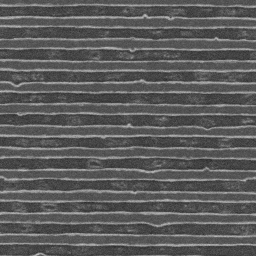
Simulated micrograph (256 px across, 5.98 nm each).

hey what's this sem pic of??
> parallel lines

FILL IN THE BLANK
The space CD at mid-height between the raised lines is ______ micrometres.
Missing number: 0.0695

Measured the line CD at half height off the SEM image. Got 58.3 nm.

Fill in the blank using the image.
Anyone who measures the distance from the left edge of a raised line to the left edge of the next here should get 130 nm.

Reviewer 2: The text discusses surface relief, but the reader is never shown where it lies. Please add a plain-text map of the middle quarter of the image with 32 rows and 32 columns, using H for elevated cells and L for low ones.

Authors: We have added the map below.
HHHHHHHHHHHHHHHHHHHHHHHHHHHHHHHH
HHHHHHHHHHHHHHHHHHHHHHHHHHHHHHHH
LLLLLLLLLLLLLLLLLLLLLLLLLLLLLLLL
LLLLLLLLLLLLLLLLLLLLLLLLLLLLLLLL
LLLLLLLLLLLLLLLLLLHHLLLLLLLLLLLL
HHHHHHHHHHHHHHHHHHHHHHHHHHHHHHHH
HHHHHHHHHHHHHHHHHHHHHHHHHHHHHHHH
LLLLLLLLLLLLLLLLLLLLLLLLLLLLLLLL
LLLLLLLLLLLLLLLLLLLLLLLLLLLLLLLL
LLLLLLLLLLLLLLLLLLLLLLLLLLLLLLLL
HHHHHHHHHHHHHHHHHHHHHHHHHHHHHHHH
HHHHHHHHHHHHHHHHHHHHHHHHHHHHHHHH
LLLLLLLLHHHHHHHHHHLHHHHHHHHHHHHH
LLLLLLLLLLLLLLLLLLLLLLLLLLLLLLLL
LLLLLLLLLLLLLLLLLLLLLLLLLLLLLLLL
LLLLLLLHHHHHHHHHHLLLLLLLLLLLLLLL
HHHHHHHHHHHHHHHHHHHHHHHHHHHHHHHH
HHHHHHHHHHHHHHHHHHHHHHHHHHHHHHHH
LLLLLLLLLLLLLLLLLLLLLLLLLLLLLLLL
LLLLLLLLLLLLLLLLLLLLLLLLLLLLLLLL
LLLLLLLLLLLLLLLLLLLLLLLLLLLLLLLL
HHHHHHHHHHHHHHHHHHHHHHHHHHHHHHHH
HHHHHHHHHHHHHHHHHHHHHHHHHHHHHHHH
LLLLLLLLLHHLLLLLLLLLLLLLLLLHHHHH
LLLLLLLLLLLLLLLLLLLLLLLLLLLLLLLL
LLLLLLLLLLLLLLLLLLLLLLLLLLLLLLLL
HHHLLLLLHHHHHHHHHHHLLLLLLHHHLLLH
HHHHHHHHHHHHHHHHHHHHHHHHHHHHHHHH
HHHHHHHHHHHHHHHHHHHHHHHHHHHHHHHH
LLLLLLLLLLLLLLLLLLLLLLLLLLLLLLLL
LLLLLLLLLLLLLLLLLLLLLLLLLLLLLLLL
LLLLLLLLLLLLLLLLLLLLLLLLLLLLLLLL